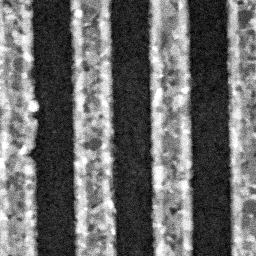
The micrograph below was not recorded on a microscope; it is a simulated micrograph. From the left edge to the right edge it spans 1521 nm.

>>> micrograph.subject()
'one or a few lines or trenches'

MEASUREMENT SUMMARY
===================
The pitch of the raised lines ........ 0.463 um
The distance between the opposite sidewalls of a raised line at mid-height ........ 162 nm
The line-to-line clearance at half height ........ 302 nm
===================